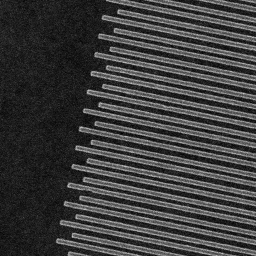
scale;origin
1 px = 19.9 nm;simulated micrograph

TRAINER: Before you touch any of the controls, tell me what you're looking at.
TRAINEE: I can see parallel lines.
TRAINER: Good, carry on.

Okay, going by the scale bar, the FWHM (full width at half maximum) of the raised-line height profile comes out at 85.1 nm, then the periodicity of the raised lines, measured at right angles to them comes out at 189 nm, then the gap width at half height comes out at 104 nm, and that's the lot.